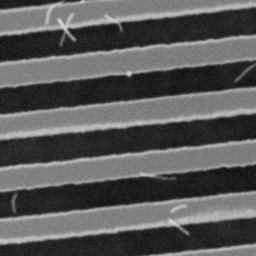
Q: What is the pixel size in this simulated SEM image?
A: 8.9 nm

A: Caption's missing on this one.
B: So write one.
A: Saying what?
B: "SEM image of lines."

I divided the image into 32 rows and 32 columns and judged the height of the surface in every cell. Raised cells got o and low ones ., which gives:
.......ooooooooooooooooooooooooo
oooooooooooooooooooooooooo......
ooooooooooooooooo...............
ooooooooo.......................
...............................o
......................oooooooooo
............oooooooooooooooooooo
...ooooooooooooooooooooooooooooo
oooooooooooooooooooooo..........
ooooooooooooo...................
oooo............................
...........................ooooo
.................ooooooooooooooo
.........ooooooooooooooooooooooo
oooooooooooooooooooooooooooo....
ooooooooooooooooooo.............
ooooooooo.......................
................................
.......................ooooooooo
.............ooooooooooooooooooo
....oooooooooooooooooooooooooooo
ooooooooooooooooooooooo.........
ooooooooooooo...................
oooo............................
...........................ooooo
.................ooooooooooooooo
........oooooooooooooooooooooooo
oooooooooooooooooooooooooo......
oooooooooooooooooo..............
oooooooooo......................
................................
.......................ooooooooo